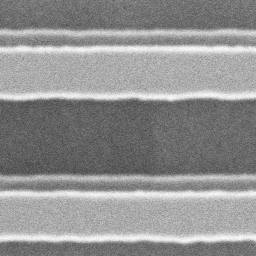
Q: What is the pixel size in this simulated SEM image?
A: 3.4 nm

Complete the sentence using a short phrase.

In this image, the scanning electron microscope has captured lines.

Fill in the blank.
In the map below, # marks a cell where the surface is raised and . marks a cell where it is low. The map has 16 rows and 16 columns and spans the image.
................
................
################
################
################
################
................
................
................
................
................
################
################
################
################
................